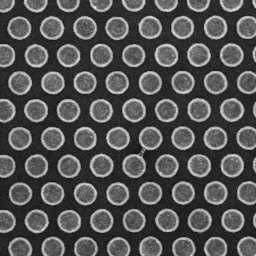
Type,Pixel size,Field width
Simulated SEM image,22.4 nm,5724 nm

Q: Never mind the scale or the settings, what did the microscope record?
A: a regular array of raised bodies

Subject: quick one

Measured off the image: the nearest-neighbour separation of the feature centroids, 0.708 micrometres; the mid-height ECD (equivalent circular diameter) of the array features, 21.8 pixels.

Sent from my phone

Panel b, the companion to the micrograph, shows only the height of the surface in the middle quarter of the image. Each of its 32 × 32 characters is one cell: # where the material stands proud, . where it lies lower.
................................
................................
....###.....###.....###.....###.
...#####...#####...#####...#####
...#####...#####...#####...#####
...#####...#####...#####...#####
....###....####.....####....####
................................
................................
###.....###.....###.....###.....
####...#####...#####...#####...#
####...#####...#####...#####...#
####...#####...#####...#####...#
###....####.....####....####....
................................
................................
....###.....###.....###.....###.
...#####...#####...#####...#####
...#####...#####...#####...#####
...#####...#####...#####...#####
....###.....###.....###.....###.
................................
...................#............
###.....###.....###.....####....
####...#####...#####...#####...#
####...#####...#####...#####...#
####...#####...#####...#####....
###.....###.....###.....####....
................................
................................
....###.....###.....####....####
...#####...#####...#####...#####